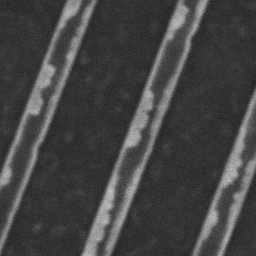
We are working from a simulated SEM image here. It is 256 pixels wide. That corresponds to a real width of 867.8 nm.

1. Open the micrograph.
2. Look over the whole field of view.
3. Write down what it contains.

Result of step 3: one or a few lines or trenches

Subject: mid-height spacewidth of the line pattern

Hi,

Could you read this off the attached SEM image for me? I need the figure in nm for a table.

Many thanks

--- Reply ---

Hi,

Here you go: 272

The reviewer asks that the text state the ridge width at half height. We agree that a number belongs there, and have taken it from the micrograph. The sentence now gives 23.2 px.